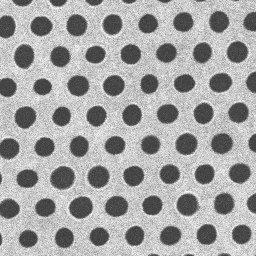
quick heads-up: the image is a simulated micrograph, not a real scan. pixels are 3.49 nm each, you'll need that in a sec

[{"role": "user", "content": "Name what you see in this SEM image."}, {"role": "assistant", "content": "a regular array of holes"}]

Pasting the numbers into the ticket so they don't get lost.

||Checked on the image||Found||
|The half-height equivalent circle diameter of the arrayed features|70.4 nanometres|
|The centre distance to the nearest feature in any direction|121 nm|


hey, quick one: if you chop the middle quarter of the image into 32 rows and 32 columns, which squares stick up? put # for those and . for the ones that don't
################################
################################
##############################.#
##....#####...######...#####....
#.....####.....####.....####....
#.....####.....####.....####....
#.....####.....#####...#####....
##...######...##################
################################
################################
########.#######..#######...####
.#####....#####....####.....####
..####.....####....####......###
..####....#####....####.....####
.#####....#####....#####...#####
#######..#######.###############
################################
##############################..
###..######....#####...######...
##....#####....####.....####....
#.....####.....####.....####....
##....####.....#####....####....
##...#######..#######.#######...
################################
################################
#################.#######...####
..#####....####.....####.....###
..####.....####.....####.....###
...###.....####.....####.....###
...###.....####....######...####
..#####...#######.##############
################################